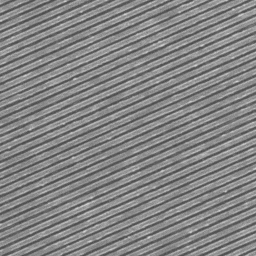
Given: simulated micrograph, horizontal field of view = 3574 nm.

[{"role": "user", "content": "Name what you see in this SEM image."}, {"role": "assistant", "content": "parallel lines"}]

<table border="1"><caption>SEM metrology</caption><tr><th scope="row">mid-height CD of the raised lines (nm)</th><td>60.7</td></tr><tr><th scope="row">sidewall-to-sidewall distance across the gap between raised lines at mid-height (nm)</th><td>49.5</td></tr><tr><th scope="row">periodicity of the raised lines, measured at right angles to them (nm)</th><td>111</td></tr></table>